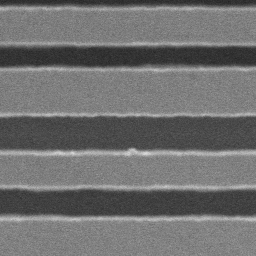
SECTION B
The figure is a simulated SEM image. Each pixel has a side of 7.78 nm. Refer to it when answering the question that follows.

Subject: lines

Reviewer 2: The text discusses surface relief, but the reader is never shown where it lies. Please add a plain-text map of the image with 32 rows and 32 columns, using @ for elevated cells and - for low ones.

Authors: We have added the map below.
--------------------------------
@@@@@@@@@@@@@@@@@@@@@@@@@@@@@@@@
@@@@@@@@@@@@@@@@@@@@@@@@@@@@@@@@
@@@@@@@@@@@@@@@@@@@@@@@@@@@@@@@@
@@@@@@@@@@@@@@@@@@@@@@@@@@@@@@@@
---@-@@--@@@@@@@@@@@-@@@@@@@@@@@
--------------------------------
--------------------------------
-----------------------------@--
@@@@@@@@@@@@@@@@@@@@@@@@@@@@@@@@
@@@@@@@@@@@@@@@@@@@@@@@@@@@@@@@@
@@@@@@@@@@@@@@@@@@@@@@@@@@@@@@@@
@@@@@@@@@@@@@@@@@@@@@@@@@@@@@@@@
@@@@@@@@@@@@@@@@@@@@@@@@@@@@@@@@
-------------------@------------
--------------------------------
--------------------------------
--------------------------------
--------------------------------
@@@@@@@@@@@@@@@@@@@@@@@@@@@@@@@@
@@@@@@@@@@@@@@@@@@@@@@@@@@@@@@@@
@@@@@@@@@@@@@@@@@@@@@@@@@@@@@@@@
@@@@@@@@@@@@@@@@@@@@@@@@@@@@@@@@
--------------------------@-----
--------------------------------
--------------------------------
--------------------------------
@@@@@@@@@@@@@@@@@@@@@@@@@@@@@@@@
@@@@@@@@@@@@@@@@@@@@@@@@@@@@@@@@
@@@@@@@@@@@@@@@@@@@@@@@@@@@@@@@@
@@@@@@@@@@@@@@@@@@@@@@@@@@@@@@@@
@@@@@@@@@@@@@@@@@@@@@@@@@@@@@@@@